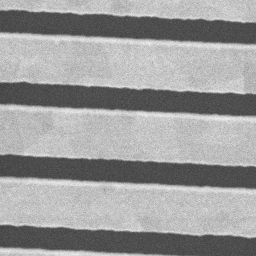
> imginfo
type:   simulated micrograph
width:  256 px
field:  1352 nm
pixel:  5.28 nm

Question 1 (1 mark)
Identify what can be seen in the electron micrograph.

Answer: lines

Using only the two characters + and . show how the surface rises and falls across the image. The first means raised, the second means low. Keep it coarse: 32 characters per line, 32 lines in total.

++++++++++++++++++++++++++++++++
.......+++++++++++++++++++++++++
..........................++++++
................................
+++++++.........................
+++++++++++++++++++++++++++++...
++++++++++++++++++++++++++++++++
++++++++++++++++++++++++++++++++
++++++++++++++++++++++++++++++++
++++++++++++++++++++++++++++++++
......++++++++++++++++++++++++++
...........................+.+++
................................
++++++..........................
++++++++++++++++++++++++++++....
++++++++++++++++++++++++++++++++
++++++++++++++++++++++++++++++++
++++++++++++++++++++++++++++++++
++++++++++++++++++++++++++++++++
....++++++++++++++++++++++++++++
..........................++++++
................................
+++++++.........................
+++++++++++++++++++++++++++.....
++++++++++++++++++++++++++++++++
++++++++++++++++++++++++++++++++
++++++++++++++++++++++++++++++++
++++++++++++++++++++++++++++++++
.........+++++++++++++++++++++++
..............................++
................................
+++++++++++.....................